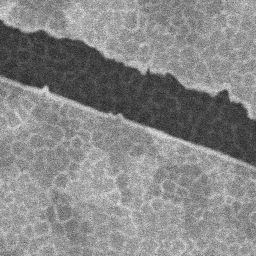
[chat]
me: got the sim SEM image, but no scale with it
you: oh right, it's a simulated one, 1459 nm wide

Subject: one or a few lines or trenches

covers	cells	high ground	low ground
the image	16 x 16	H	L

HHHHHHHHHHHHHHHH
LHHHHHHHHHHHHHHH
LLLLLHHHHHHHHHHH
LLLLLLLHHHHHHHHH
LLLLLLLLLLHHHHHH
HLLLLLLLLLLLLHHH
HHHHHLLLLLLLLLLH
HHHHHHHHLLLLLLLL
HHHHHHHHHHLLLLLL
HHHHHHHHHHHHHLLL
HHHHHHHHHHHHHHHH
HHHHHHHHHHHHHHHH
HHHHHHHHHHHHHHHH
HHHHHHHHHHHHHHHH
HHHHHHHHHHHHHHHH
HHHHHHHHHHHHHHHH